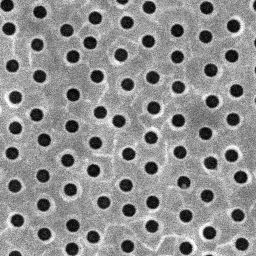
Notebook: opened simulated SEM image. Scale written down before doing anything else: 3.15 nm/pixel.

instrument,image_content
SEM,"a regular array of holes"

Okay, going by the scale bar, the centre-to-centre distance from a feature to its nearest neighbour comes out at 86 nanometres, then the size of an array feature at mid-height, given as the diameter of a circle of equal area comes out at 13.9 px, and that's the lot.